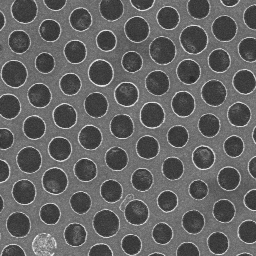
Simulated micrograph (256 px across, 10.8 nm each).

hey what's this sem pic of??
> a regular array of holes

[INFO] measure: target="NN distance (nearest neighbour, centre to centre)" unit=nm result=350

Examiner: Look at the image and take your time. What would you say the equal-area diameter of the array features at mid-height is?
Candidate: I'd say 0.248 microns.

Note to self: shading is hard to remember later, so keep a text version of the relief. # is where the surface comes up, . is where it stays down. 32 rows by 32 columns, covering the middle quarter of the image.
#######.....###....##########...
######......###....#########....
#..###......#########....###....
....##......########......###...
....###.....########......####..
....#####.###.....###.....######
....#########......##.....######
...####..####......###...###...#
######....###......########.....
#####......##.....#########.....
..###......####.####....###.....
...##......########......##.....
...###....####.####......###....
...#########.....##......#######
...#########.....##......#######
..####.#####.....###....####.###
####.....###.....#########.....#
####.....###.....#########.....#
####......###...###...####.....#
.###.....#########......##.....#
..###....#########......###...##
..#########....###......########
..########......##.....#########
.#########......####..####..####
###....###......#########.....##
###.....###....##########.....##
###.....####..####...####.....##
###.....#########.....###.....##
.##....##########.....####...###
.#########...####.....##########
.########.....###.....#########.
#########......###...##########.